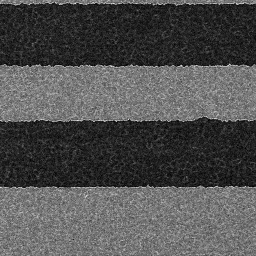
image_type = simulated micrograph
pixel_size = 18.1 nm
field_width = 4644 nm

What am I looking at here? one or a few lines or trenches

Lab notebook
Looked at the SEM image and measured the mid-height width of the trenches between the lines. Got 1170 nm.